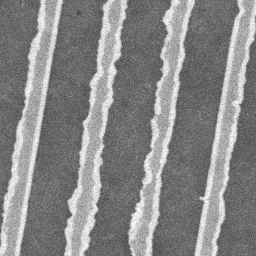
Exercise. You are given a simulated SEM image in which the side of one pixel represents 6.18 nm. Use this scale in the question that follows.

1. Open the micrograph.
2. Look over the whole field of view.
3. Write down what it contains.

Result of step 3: one or a few lines or trenches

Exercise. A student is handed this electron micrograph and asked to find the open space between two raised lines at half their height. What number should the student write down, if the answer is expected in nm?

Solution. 301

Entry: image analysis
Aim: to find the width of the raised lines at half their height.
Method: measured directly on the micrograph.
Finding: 0.102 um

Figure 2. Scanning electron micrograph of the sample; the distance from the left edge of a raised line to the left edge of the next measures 399 nanometres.